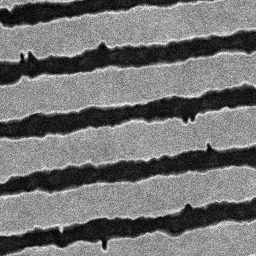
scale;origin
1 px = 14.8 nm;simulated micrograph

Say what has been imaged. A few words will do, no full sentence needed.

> parallel lines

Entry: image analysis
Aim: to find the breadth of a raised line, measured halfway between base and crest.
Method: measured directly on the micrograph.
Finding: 37.4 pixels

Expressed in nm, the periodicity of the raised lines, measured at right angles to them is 834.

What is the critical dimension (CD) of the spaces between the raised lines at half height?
277 nanometers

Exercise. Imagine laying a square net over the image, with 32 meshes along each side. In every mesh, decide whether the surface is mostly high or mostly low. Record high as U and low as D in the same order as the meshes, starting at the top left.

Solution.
UUUDDDDDDDDDDDDDDDDDDDUUUUUUUUUU
DDDDDDDDDDDDDUUUUUUUUUUUUUUUUUUU
DDDDDDDUUUUUUUUUUUUUUUUUUUUUUUUU
UUUUUUUUUUUUUUUUUUUUUUUUUUUUUUUU
UUUUUUUUUUUUUUUUUUUUUUUUUUUUUDDD
UUUUUUUUUUUUUUUUUUUUUDDDDDDDDDDD
UUUUUUUUUUUDDDDDDDDDDDDDDDDUUUUD
UUUDDDDDDDDDDDDDDDDDDDDUUUUUUUUU
DDDDDDDDDDDDDUUUUUUUUUUUUUUUUUUU
DDDDDUUUUUUUUUUUUUUUUUUUUUUUUUUU
DDUUUUUUUUUUUUUUUUUUUUUUUUUUUUUU
UUUUUUUUUUUUUUUUUUUUUUUUUUDDDDDD
UUUUUUUUUUUUUUUUUUUUDDDDDDDDDDDD
UUUUUUUUUUUDUDDDDDDDDDDDDDDDUUUU
UUUDDDDDDDDDDDDDDDDDDDDDDUUUUUUU
DDDDDDDDDDDDDDDUUUUUUUUUUUUUUUUU
DDDDDDDDDUUUUUUUUUUUUUUUUUUUUUUU
UUUUUUUUUUUUUUUUUUUUUUUUUUUUUUUU
UUUUUUUUUUUUUUUUUUUUUUUUUUDUUUUD
UUUUUUUUUUUUUUUUUUUUDUDDDDDDDDDD
UUUUUUUUUUUUUUDDDDDDDDDDDDDDDDDD
UUUUDDDDDDDDDDDDDDDDDDDUUUUUUUUU
UDDDDDDDDDDDDDDDDDUUUUUUUUUUUUUU
DDDDDDDDDUUUUUUUUUUUUUUUUUUUUUUU
UUUUUUUUUUUUUUUUUUUUUUUUUUUUUUUU
UUUUUUUUUUUUUUUUUUUUUUUUUUDDDDDD
UUUUUUUUUUUUUUUUUUUUUUDDDDDDDDDD
UUUUUUUUUUUDDDDDDDDDDDDDDDDDDDDD
UUUUUUUUDDDDDDDDDDDDDDDDDUUUUUUU
DDDDDDDDDDDDDDDDDUUUUUUUUUUUUUUU
DDDDDDDDDUUUUUUUUUUUUUUUUUUUUUUU
DDUUUUUUUUUUUUUUUUUUUUUUUUUUUUUU